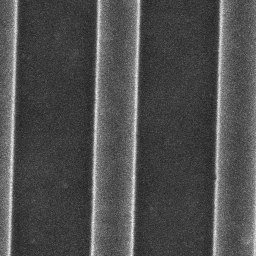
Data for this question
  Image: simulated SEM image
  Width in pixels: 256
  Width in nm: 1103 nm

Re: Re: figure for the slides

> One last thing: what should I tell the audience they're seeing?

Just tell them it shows one or a few lines or trenches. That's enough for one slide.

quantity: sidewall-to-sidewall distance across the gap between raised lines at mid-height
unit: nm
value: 352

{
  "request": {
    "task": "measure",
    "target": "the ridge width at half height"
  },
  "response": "0.175 microns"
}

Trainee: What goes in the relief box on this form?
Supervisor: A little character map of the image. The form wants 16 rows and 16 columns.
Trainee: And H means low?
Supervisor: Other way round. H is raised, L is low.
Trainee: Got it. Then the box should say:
HLLLLLHHHLLLLLHH
HLLLLLHHHLLLLLHH
HLLLLLHHHLLLLLHH
HLLLLLHHHLLLLLHH
HLLLLLHHHLLLLLHH
HLLLLLHHHLLLLLHH
HLLLLLHHHLLLLLHH
HLLLLLHHLLLLLLHH
HLLLLLHHLLLLLLHH
HLLLLLHHLLLLLLHH
HLLLLLHHLLLLLLHH
HLLLLLHHLLLLLLHH
HLLLLLHHLLLLLHHH
HLLLLLHHLLLLLHHH
HLLLLLHHLLLLLHHH
HLLLLLHHLLLLLHHH